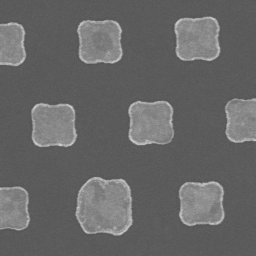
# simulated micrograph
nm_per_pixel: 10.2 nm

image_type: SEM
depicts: raised bodies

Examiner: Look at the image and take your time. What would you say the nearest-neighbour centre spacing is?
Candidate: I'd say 979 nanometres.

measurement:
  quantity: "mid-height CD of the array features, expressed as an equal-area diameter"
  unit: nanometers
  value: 484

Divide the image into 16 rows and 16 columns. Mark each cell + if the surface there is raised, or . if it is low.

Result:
................
+....++....+++..
+....+++...+++..
++...++....++...
................
................
........++....++
..+++...+++...++
..+++...+++...++
................
................
.....+++....++..
++...+++...+++..
++...+++...+++..
......++........
................